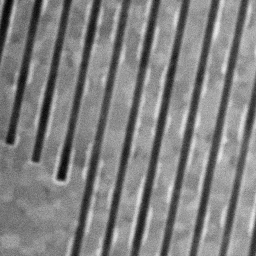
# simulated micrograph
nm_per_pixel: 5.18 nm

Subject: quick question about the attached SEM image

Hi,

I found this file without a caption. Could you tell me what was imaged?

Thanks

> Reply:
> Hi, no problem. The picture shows parallel lines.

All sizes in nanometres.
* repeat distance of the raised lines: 150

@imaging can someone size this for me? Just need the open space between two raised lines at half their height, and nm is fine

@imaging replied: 46.3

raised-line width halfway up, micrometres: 0.101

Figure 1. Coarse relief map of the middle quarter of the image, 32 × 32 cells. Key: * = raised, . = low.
****..*****...*****..*****..****
****..*****..*****...*****..****
***...*****..*****...****...****
***...****...*****...****...****
***..*****...*****..*****...****
***..*****...*****..*****..*****
***..*****..*****...*****..*****
**...*****..*****...****...*****
**...****...*****...****...*****
**..*****...*****..*****...*****
**..*****...*****..*****..*****.
**..*****..*****...*****..*****.
*...*****..*****...****...*****.
*...****...*****...****...*****.
*...****...*****..*****...*****.
*..*****...*****..*****..*****..
*..*****..*****...*****..*****..
...*****..*****...*****..*****..
...****...*****...****...*****..
..*****...*****..*****...*****..
..*****...*****..*****..*****...
..*****..*****...*****..*****..*
..*****..*****...****...*****..*
.*****...*****...****...*****..*
.*****...*****..*****...****...*
.*****...*****..*****..*****...*
.*****..*****...*****..*****..**
.*****..*****...****...*****..**
.****...*****..*****...*****..**
*****...*****..*****...****...**
*****...****...*****..*****...**
*****..*****...*****..*****..***